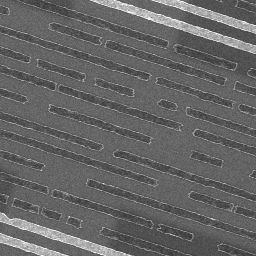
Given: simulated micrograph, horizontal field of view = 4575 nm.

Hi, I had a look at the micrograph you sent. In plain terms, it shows parallel lines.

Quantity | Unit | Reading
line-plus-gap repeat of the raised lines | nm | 353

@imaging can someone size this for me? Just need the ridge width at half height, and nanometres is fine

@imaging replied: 132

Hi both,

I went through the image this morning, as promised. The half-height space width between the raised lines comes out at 0.225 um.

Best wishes